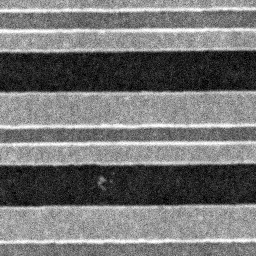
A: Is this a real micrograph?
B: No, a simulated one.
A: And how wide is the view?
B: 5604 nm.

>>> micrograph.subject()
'lines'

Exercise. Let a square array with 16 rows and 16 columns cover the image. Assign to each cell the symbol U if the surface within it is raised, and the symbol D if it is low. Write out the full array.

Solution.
UUUUUUUUUUUUUUUU
UUUUUUUUUUUUUUUU
UUUUUUUUUUUUUUUU
DDDDDDDDDDDDDDDD
DDDDDDDDDDDDDDDD
DDDDDDDDDDDDDDDD
UUUUUUUUUUUUUUUU
UUUUUUUUUUUUUUUU
UUUUUUUUUUUUUUUU
UUUUUUUUUUUUUUUU
DDDDDDDDDDDDDDDD
DDDDDDDDDDDDDDDD
DDDDDDDDDDDDDDDD
UUUUUUUUUUUUUUUU
UUUUUUUUUUUUUUUU
UUUUUUUUUUUUUUUU